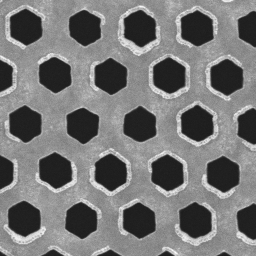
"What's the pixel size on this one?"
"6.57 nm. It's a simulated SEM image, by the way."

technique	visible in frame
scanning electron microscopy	a regular array of holes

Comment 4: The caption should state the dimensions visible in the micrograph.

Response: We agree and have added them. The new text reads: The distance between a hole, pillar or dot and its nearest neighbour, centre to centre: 362 nm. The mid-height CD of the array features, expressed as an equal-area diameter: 220 nanometres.